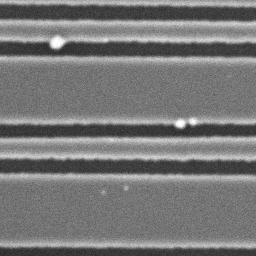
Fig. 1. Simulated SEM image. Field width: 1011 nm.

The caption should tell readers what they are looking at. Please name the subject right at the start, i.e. lines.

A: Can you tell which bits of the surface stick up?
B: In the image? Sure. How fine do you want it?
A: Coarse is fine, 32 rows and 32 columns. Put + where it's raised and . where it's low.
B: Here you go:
..+.....+++.++++++++++++++++++++
................................
................................
++++++++++++++++++++++++++++++++
++++++++++++++++++++++++++++++++
......++........................
................................
++++++++++++++++++++++++++++++++
++++++++++++++++++++++++++++++++
++++++++++++++++++++++++++++++++
++++++++++++++++++++++++++++++++
++++++++++++++++++++++++++++++++
++++++++++++++++++++++++++++++++
++++++++++++++++++++++++++++++++
++++++++++++++++++++++++++++++++
......................+.+.......
................................
++++++++++++++++++++++++++++++++
++++++++++++++++++++++++++++++++
++++++++++++++++++++++++++++++++
................................
................................
++++++++++++++++++++++++++++++++
++++++++++++++++++++++++++++++++
++++++++++++++++++++++++++++++++
++++++++++++++++++++++++++++++++
++++++++++++++++++++++++++++++++
++++++++++++++++++++++++++++++++
++++++++++++++++++++++++++++++++
++++++++++++++++++++++++++++++++
++++++++++++++++++++++++++++++++
................................